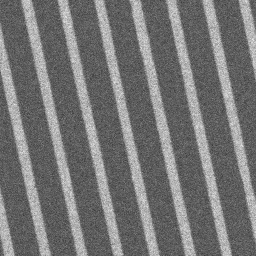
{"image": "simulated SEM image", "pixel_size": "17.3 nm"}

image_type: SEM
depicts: parallel lines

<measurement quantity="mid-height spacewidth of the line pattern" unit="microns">0.451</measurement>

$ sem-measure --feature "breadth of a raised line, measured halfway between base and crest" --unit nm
157